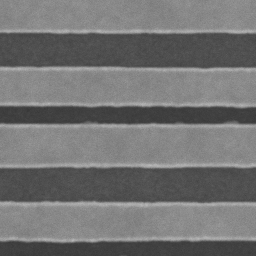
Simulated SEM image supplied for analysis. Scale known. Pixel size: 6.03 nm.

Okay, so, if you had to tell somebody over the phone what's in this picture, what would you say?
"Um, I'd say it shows lines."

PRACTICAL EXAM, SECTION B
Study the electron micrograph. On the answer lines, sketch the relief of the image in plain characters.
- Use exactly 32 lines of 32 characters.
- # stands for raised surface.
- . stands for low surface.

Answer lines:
################################
################################
################################
################################
................................
................................
................................
................................
################................
################################
################################
################################
################################
................................
................................
#.........#.......##........#...
################################
################################
################################
################################
################################
................................
................................
................................
................................
################################
################################
################################
################################
################################
................................
................................